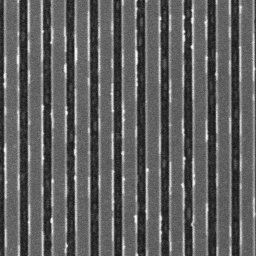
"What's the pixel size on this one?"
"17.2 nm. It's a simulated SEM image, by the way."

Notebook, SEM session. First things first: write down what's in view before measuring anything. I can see parallel lines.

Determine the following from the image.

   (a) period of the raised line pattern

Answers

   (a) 404 nm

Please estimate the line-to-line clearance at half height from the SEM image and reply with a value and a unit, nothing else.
146 nm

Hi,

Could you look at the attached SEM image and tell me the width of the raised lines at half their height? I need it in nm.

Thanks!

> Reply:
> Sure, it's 260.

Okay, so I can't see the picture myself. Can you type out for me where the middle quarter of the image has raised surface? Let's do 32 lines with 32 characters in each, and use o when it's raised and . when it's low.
...ooo...ooo...ooo..oooo..oooo..
...ooo...ooo...ooo..oooo..oooo..
...ooo...ooo...ooo..oooo..oooo..
...ooo...ooo...ooo..oooo..oooo..
...ooo...ooo...ooo..oooo..oooo..
...ooo...ooo...ooo..oooo..oooo..
...ooo...ooo...ooo..oooo..oooo..
...ooo...ooo...ooo..oooo..oooo..
...ooo...ooo...ooo..oooo..oooo..
...ooo...ooo...ooo..oooo..oooo..
o..ooo...ooo...ooo..oooo..oooo..
o..ooo...ooo...ooo..oooo..oooo..
o..ooo...ooo...ooo..oooo..oooo..
...ooo...ooo...ooo...ooo..oooo..
...ooo...ooo...ooo...ooo..oooo..
...ooo...ooo...ooo...ooo..oooo..
o..ooo...ooo...ooo...ooo..oooo..
o..ooo...ooo...ooo...ooo..oooo..
o..ooo...ooo...ooo..oooo..oooo..
o..ooo...ooo...ooo...ooo..oooo..
o..ooo...ooo...ooo...ooo..oooo..
o..ooo...ooo...ooo...ooo..oooo..
o..ooo...ooo...ooo..oooo..oooo..
o..ooo...ooo...ooo..oooo..oooo..
o..ooo...ooo...ooo..oooo..oooo..
o..ooo...ooo...ooo..oooo..oooo..
o..ooo...ooo...ooo..oooo..oooo..
o..ooo...ooo...ooo..oooo..oooo..
o..ooo...ooo...ooo..oooo..oooo..
o..ooo...ooo...ooo..oooo..oooo..
o..ooo...ooo...ooo..oooo..oooo..
o..ooo...ooo...ooo..oooo..oooo..